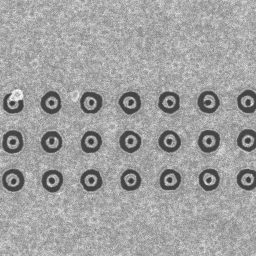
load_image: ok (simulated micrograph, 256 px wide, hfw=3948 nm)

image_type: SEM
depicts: a regular array of ring-shaped grooves with a dot in the middle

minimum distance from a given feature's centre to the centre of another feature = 0.591 um